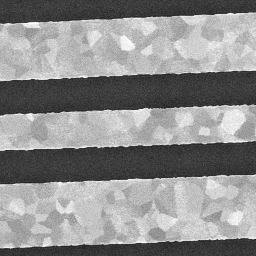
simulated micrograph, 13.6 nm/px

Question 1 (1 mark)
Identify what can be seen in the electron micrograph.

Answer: lines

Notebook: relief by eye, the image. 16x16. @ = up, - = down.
----------------
@@@@@@@@@@@@@@@@
@@@@@@@@@@@@@@@@
@@@@@@@@@@@@@@@@
@@@@@@@@@@@@@---
----------------
----------------
@@@@@@@@@@@@@@@@
@@@@@@@@@@@@@@@@
----------------
----------------
--@@@@@@@@@@@@@@
@@@@@@@@@@@@@@@@
@@@@@@@@@@@@@@@@
@@@@@@@@@@@@@@@@
----------------